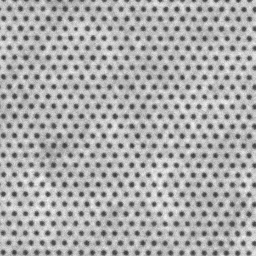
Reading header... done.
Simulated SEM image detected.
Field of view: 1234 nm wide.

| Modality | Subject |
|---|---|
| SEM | a regular array of holes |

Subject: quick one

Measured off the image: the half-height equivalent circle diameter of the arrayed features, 26.1 nm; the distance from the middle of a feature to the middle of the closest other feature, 11 px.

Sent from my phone